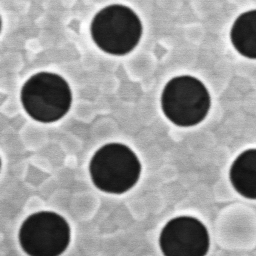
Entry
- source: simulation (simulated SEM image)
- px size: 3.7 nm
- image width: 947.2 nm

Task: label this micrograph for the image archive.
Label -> holes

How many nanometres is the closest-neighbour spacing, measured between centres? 361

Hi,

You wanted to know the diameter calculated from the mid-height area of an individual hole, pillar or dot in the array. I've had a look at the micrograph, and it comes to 188 nm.